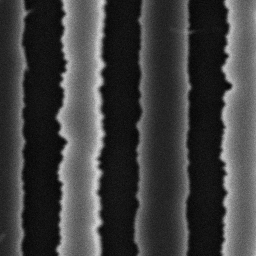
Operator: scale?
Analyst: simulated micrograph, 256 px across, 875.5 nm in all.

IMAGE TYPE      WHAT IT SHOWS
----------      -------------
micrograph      lines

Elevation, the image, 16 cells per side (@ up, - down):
@@--@@@--@@@--@@
@@--@@---@@@--@@
@---@@---@@@--@@
@@--@@---@@@--@@
@@--@@---@@@--@@
@---@@---@@@--@@
@---@@---@@@--@@
@---@@---@@@--@@
@---@@---@@@--@@
@---@@---@@@--@@
@---@@---@@@--@@
@---@@---@@@--@@
@---@@---@@@--@@
@---@@--@@@@--@@
@---@@--@@@@--@@
@---@@---@@@--@@